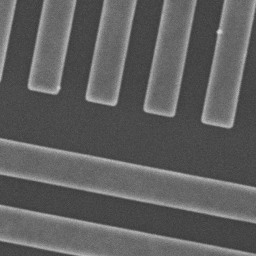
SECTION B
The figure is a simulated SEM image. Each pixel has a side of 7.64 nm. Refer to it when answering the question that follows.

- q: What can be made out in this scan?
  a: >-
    groups of lines, slits or small figures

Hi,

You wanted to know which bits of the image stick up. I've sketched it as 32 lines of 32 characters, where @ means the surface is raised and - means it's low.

@@---@@@@----@@@@---@@@@@---@@@@
@@---@@@@----@@@@---@@@@----@@@@
@@---@@@@----@@@@---@@@@----@@@@
@----@@@@---@@@@----@@@@---@@@@-
@----@@@@---@@@@----@@@@---@@@@-
@---@@@@@---@@@@----@@@@---@@@@-
@---@@@@----@@@@---@@@@----@@@@-
@---@@@@----@@@@---@@@@----@@@@-
----@@@@---@@@@----@@@@---@@@@--
----@@@@---@@@@----@@@@---@@@@--
----@@@@---@@@@----@@@@---@@@@--
-----@@----@@@@---@@@@----@@@@--
-----------@@@@---@@@@----@@@@--
------------------@@@@---@@@@@--
-------------------------@@@@---
--------------------------@@@---
--------------------------------
@-------------------------------
@@@@@@--------------------------
@@@@@@@@@@@@--------------------
@@@@@@@@@@@@@@@@----------------
@@@@@@@@@@@@@@@@@@@@@@----------
----@@@@@@@@@@@@@@@@@@@@@@@-----
---------@@@@@@@@@@@@@@@@@@@@@@@
--------------@@@@@@@@@@@@@@@@@@
-------------------@@@@@@@@@@@@@
@@@@--------------------@@@@@@@@
@@@@@@@@@@--------------------@@
@@@@@@@@@@@@@@@-----------------
@@@@@@@@@@@@@@@@@@@@------------
--@@@@@@@@@@@@@@@@@@@@@@@-------
-------@@@@@@@@@@@@@@@@@@@@@@@--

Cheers